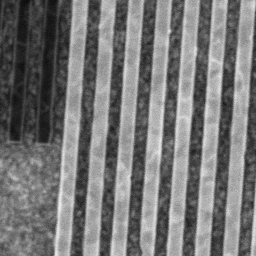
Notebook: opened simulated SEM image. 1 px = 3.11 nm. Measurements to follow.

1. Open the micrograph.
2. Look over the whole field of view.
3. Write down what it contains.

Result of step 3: parallel lines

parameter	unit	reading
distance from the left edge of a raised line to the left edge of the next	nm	86.5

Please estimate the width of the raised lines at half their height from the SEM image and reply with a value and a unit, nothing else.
42.2 nm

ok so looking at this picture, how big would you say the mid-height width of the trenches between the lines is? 14.3 px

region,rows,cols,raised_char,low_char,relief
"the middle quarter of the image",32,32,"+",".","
.++++...++++...++++...+++....+++
.++++...++++...++++...+++....+++
.+++....+++....+++....+++....+++
.+++....+++....+++....+++....+++
.+++....+++....+++....+++....+++
.+++....+++....+++....+++....+++
.+++....+++....+++....+++....+++
.+++....+++....+++....+++....+++
.+++....+++....+++....+++....+++
.+++....+++....+++....+++....+++
.+++....+++...++++....+++....+++
.+++....+++...++++...++++...++++
.+++....+++....+++...++++...++++
++++...++++...++++...+++....++++
++++...++++...++++...++++...++++
++++...++++...++++...++++...++++
+++....+++....+++....+++....+++.
+++....+++....+++....+++....+++.
+++....+++....+++....+++....+++.
+++....+++....+++....+++....+++.
+++....+++....+++....+++....+++.
+++....+++....+++....+++....+++.
+++....+++....+++....+++....+++.
+++....+++....+++....+++....+++.
+++....+++...++++....+++....+++.
+++....+++...++++...++++...++++.
+++....+++...++++...++++...++++.
+++...++++...++++...+++....++++.
+++...++++...+++....+++....+++..
+++...++++...++++...++++...+++..
++....+++....+++....+++....+++..
++....+++....+++....+++....+++..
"